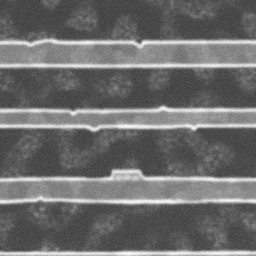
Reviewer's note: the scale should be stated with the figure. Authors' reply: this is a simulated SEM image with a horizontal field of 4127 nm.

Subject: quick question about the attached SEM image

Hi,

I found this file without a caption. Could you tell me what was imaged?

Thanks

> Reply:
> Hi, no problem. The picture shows one or a few lines or trenches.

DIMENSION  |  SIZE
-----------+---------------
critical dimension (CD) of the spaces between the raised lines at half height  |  836 nanometers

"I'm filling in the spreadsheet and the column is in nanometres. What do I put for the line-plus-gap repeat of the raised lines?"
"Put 1090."